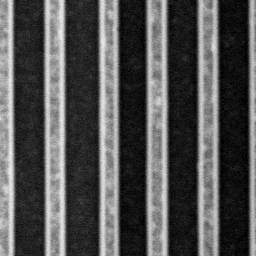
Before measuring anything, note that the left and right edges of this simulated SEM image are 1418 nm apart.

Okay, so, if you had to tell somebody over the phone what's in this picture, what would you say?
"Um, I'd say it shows parallel lines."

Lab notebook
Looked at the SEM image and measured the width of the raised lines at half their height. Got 89.3 nm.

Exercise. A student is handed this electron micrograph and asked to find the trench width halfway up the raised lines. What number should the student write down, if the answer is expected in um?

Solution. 0.193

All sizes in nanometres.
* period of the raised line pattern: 283